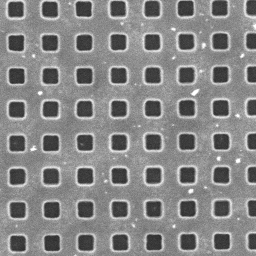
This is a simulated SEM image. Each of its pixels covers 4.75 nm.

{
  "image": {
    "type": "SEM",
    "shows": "a regular array of holes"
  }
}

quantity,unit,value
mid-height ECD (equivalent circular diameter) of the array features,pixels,17.8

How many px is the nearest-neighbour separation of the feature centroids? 33.1